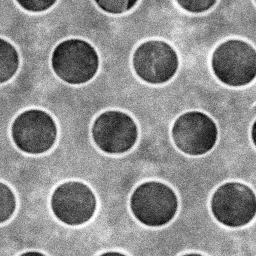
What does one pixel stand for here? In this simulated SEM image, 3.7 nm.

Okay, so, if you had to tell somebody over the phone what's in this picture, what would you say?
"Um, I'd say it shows holes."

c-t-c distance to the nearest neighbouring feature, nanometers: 297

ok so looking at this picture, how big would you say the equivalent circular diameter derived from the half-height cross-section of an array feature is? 170 nm